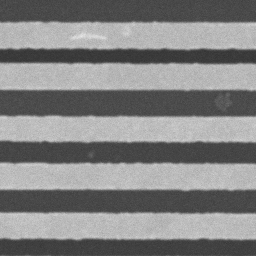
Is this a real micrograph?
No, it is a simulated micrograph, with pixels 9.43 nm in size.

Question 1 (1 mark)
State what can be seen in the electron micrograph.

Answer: lines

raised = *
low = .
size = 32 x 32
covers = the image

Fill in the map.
................................
................................
................................
********************************
********************************
********************************
................................
................................
********************************
********************************
********************************
................................
................................
................................
................................
********************************
********************************
.*******************************
................................
................................
******..******.*.*.****..**.....
********************************
********************************
********************************
................................
................................
................................
********************************
********************************
********************************
................................
................................